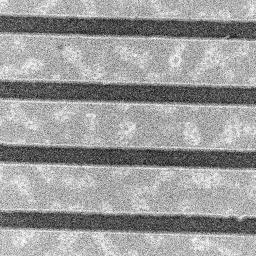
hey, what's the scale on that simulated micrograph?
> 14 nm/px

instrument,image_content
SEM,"one or a few lines or trenches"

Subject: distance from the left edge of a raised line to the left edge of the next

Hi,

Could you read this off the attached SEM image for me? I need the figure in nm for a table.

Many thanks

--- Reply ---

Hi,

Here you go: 909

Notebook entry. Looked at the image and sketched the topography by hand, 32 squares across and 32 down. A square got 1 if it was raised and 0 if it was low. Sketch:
11111111111111111111111111111111
11111111111111111111111111111111
00000000000000000000000000111011
00000000000000000000000000000000
11111111011000000000000000000000
11111111111111111111111111111111
11111111111111111111111111111111
11111111111111111111111111111111
11111111111111111111111111111111
11111111111111111111111111111111
00000000000000000000011111111111
00000000000000000000000000000000
10000000000000000000000000000000
11111111111111111111111111111111
11111111111111111111111111111111
11111111111111111111111111111111
11111111111111111111111111111111
11111111111111111111111111111111
00000000000000001100111111111111
00000000000000000000000000000000
11100000000000000000000000000000
11111111111111111111111111111111
11111111111111111111111111111111
11111111111111111111111111111111
11111111111111111111111111111111
11111111111111111111111111111111
00000000001111111111111111111111
00000000000000000000000000000000
00000000000000000000000000000000
11111111111111111111111111111111
11111111111111111111111111111111
11111111111111111111111111111111